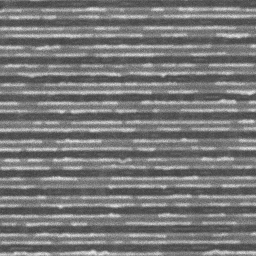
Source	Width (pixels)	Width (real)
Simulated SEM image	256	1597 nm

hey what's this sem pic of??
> parallel lines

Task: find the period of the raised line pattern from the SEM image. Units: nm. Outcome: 117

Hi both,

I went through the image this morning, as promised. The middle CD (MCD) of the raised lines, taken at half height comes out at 66.3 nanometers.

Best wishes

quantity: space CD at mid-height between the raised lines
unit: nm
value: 49.9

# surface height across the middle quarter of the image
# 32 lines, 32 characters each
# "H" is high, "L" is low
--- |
HHHHHHHHHHHHHHHHHHHHHHHHHHHHHHHH
HHHHHHHHHHHHHHHHHHHHHHHHHHHHHHHH
HHHHHHHHHHHHHHHHHHHHHHHHHHHHHHHH
LLLLLLLLLLLLLLLLLLLLLLLLLLLLLLLL
LLLLLLLLLLLLLLLLLLLLLLLLLLLLLLLL
HHHHHHHHHHHHHHHHHHHHHHHHHHHHHHHH
HHHHHHHHHHHHHHHHHHHHHHHHHHHHHHHH
LLLLHHLLLLHLLLLLLLLLLLLLLLLLLLLL
LLLLLLLLLLLLLLLLLLLLLLLLLLLLLLLL
LLLLLLLLLLLLLLLLLLHHHHHHHHHHHHHL
HHHHHHHHHHHHHHHHHHHHHHHHHHHHHHHH
HHHHHHHHHHHHHHHHHHHHHHHHHHHHHHHH
LLLLLLLLLLLLLLLLLLLLLLLLLLLLLLLL
LLLLLLLLLLLLLLLLLLLLLLLLLLLLLLLL
HHHHHHHHHHHHHHHHHHHHHHHHHHHHHHHH
HHHHHHHHHHHHHHHHHHHHHHHHHHHHHHHH
HHHHHHHHHHHHHHHHHHHHHHHHHHHHHHHH
LLLLLLLLLLLLLLLLLLLLLLLLLLLLLLLL
LLLLLLLLLLLLLLLLLLLLLLLLLLLLLLLL
HHHHHHHHHHHHHHHHHHHHHHHHHHHHHHHH
HHHHHHHHHHHHHHHHHHHHHHHHHHHHHHHH
HLLLLLLLLLLLLLLLLLLHHHHLLLLLLLLL
LLLLLLLLLLLLLLLLLLLLLLLLLLLLLLLL
HLLLLLLLLLLLLLLLLLLLLLLLLLLLLLLL
HHHHHHHHHHHHHHHHHHHHHHHHHHHHHHHH
HHHHHHHHHHHHHHHHHHHHHHHHHHHHHHHH
LLLLLLLLLLLLLLLLLLLLLLLLLLLLLLLL
LLLLLLLLLLLLLLLLLLLLLLLLLLLLLLLL
HHHHHHHHHHHHHHHHHHHHHHHHHHHHHHHH
HHHHHHHHHHHHHHHHHHHHHHHHHHHHHHHH
HHHHHHHHHHHHHHHHHHHHHHHHHHHHHHHH
LLLLLLLLLLLLLLLLLLLLLLLLLLLLLLLL